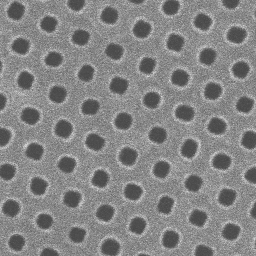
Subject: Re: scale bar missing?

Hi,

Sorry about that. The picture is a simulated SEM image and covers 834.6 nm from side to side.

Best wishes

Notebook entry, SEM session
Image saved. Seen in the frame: a regular array of holes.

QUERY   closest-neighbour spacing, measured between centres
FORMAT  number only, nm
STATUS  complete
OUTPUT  113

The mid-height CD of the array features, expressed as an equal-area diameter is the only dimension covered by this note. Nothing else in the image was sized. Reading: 55.6 nm